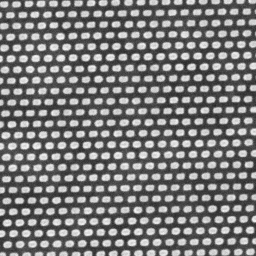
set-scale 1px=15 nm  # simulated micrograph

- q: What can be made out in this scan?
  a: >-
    a regular array of raised bodies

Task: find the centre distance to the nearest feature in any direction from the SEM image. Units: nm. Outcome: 182